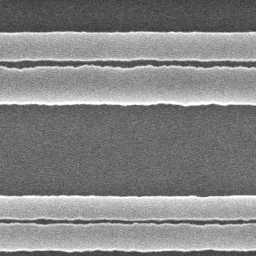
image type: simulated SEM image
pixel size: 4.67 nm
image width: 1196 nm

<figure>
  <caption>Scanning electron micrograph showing lines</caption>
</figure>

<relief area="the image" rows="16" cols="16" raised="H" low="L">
LLLLLLLLLLLLLLLL
LLLLLLLLLLLLLLLL
HHHHHHHHHHHHHHHH
HHHHHHHHHHHHHHHH
HHHHHHHHHHHHHHHH
HHHHHHHHHHHHHHHH
LLLLLLLHLLLHLLLL
LLLLLLLLLLLLLLLL
LLLLLLLLLLLLLLLL
LLLLLLLLLLLLLLLL
LLLLLLLLLLLLLLLL
LLLLLLLLLLLLLLLL
HHHHHHHHHHHHHHHH
HHHHHHHHHHHHHHHH
HHHHHHHHHHHHHHHH
HHHHHHHHHHHHHHHH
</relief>